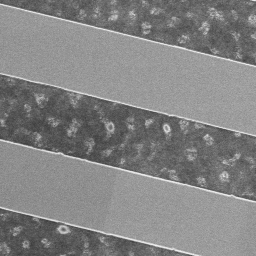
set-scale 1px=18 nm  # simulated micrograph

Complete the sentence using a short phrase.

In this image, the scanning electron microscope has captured one or a few lines or trenches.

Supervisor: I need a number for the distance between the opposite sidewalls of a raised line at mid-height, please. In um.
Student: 1.21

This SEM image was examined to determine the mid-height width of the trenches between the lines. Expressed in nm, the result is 1160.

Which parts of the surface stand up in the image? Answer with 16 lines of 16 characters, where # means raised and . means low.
#...............
#####...........
#########.......
#############...
################
....############
........########
............####
................
###.............
#######.........
###########.....
###############.
..##############
......##########
..........######